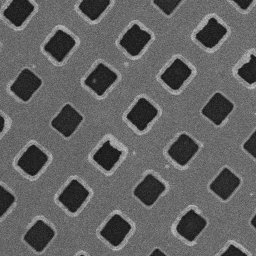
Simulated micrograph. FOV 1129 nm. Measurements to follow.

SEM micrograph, a regular array of holes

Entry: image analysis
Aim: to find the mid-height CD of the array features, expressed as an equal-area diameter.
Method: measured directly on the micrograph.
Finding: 0.126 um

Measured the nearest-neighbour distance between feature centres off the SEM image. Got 0.23 microns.